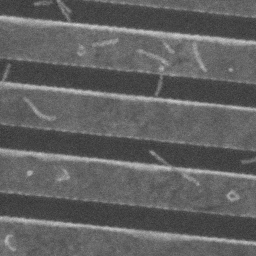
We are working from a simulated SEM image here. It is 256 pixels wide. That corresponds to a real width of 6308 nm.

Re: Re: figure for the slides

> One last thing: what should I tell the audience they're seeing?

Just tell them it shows lines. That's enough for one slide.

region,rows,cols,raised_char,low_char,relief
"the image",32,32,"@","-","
----------------@@@@@@@@@@@@@@@@
--------------------------@@@@@@
@@@-----------------------------
@@@@@@@@@@@@@-------------------
@@@@@@@@@@@@@@@@@@@@@@@---------
@@@@@@@@@@@@@@@@@@@@@@@@@@@@@@@@
@@@@@@@@@@@@@@@@@@@@@@@@@@@@@@@@
---@@@@@@@@@@@@@@@@@@@@@@@@@@@@@
-------------@@@@@@@@@@@@@@@@@@@
-----------------------@@@@@@@@@
@-------------------------------
@@@@@@@@@@----------------------
@@@@@@@@@@@@@@@@@@@@------------
@@@@@@@@@@@@@@@@@@@@@@@@@@@@@@@-
@@@@@@@@@@@@@@@@@@@@@@@@@@@@@@@@
@@@@@@@@@@@@@@@@@@@@@@@@@@@@@@@@
----------@@@@@@@@@@@@@@@@@@@@@@
-------------------@@@@@@@@@@@@@
-----------------------------@@@
@@@@@@--------------------------
@@@@@@@@@@@@@@@@----------------
@@@@@@@@@@@@@@@@@@@@@@@@@@@-----
@@@@@@@@@@@@@@@@@@@@@@@@@@@@@@@@
@@@@@@@@@@@@@@@@@@@@@@@@@@@@@@@@
-----@@@@@@@@@@@@@@@@@@@@@@@@@@@
----------------@@@@@@@@@@@@@@@@
-------------------------@@@@@@@
@@@-----------------------------
@@@@@@@@@@@@@@------------------
@@@@@@@@@@@@@@@@@@@@------------
@@@@@@@@@@@@@@@@@@@@@@@@@@@@@@@@
@@@@@@@@@@@@@@@@@@@@@@@@@@@@@@@@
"